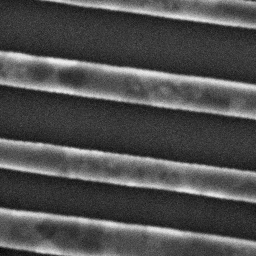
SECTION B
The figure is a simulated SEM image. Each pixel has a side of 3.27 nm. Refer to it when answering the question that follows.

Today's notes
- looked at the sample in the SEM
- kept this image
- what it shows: lines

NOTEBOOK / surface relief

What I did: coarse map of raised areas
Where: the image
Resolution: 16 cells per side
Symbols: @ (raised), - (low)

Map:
------@@@@@@@@@@
--------------@@
----------------
@@--------------
@@@@@@@@@-------
--@@@@@@@@@@@@@@
---------@@@@@@@
----------------
----------------
@@@@@@----------
-@@@@@@@@@@@@@--
-------@@@@@@@@@
---------------@
@@@@------------
@@@@@@@@@@@-----
-@@@@@@@@@@@@@@@